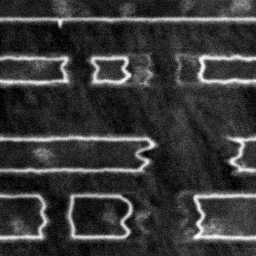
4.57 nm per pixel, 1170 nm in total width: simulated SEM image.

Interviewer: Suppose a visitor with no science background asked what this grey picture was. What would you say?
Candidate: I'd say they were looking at one or a few lines or trenches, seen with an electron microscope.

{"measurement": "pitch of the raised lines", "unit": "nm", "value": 330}